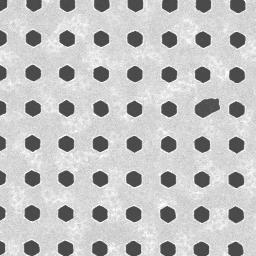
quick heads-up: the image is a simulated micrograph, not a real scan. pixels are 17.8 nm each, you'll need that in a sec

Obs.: a regular array of holes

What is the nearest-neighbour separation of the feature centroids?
33.9 pixels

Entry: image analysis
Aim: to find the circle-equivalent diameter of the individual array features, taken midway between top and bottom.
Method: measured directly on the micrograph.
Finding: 288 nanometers